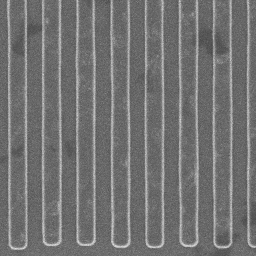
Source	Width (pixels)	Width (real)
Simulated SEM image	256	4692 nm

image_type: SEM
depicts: parallel lines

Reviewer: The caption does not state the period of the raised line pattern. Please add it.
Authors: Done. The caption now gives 626 nm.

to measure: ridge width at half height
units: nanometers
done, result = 318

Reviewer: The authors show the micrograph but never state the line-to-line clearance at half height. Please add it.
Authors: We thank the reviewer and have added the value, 0.3 um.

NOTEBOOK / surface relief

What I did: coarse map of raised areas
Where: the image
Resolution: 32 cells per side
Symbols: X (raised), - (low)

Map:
-XX--XXX--XX--XX--XX---XX--XX--X
-XX--XX---XX--XX--XX---XX--XX--X
-XX--XX---XX--XX--XX---XX--XX--X
-XX--XX---XX--XX--XX---XX--XX--X
-XX--XX---XX--XX--XX---XX--XX--X
-XX--XX---XX--XX--XX---XX--XX--X
-XX--XX---XX--XX--XX---XX--XX--X
-XX--XX---XX--XX--XX---XX--XX--X
-XX--XX---XX--XX--XX---XX--XX--X
-XX--XX---XX--XX--XX---XX--XX--X
-XX--XX---XX--XX--XX---XX--XX--X
-XX--XX---XX--XX--XX---XX--XX--X
-XX--XX---XX--XX--XX---XX--XX--X
-XX--XX---XX--XX--XX---XX--XX--X
-XX--XX---XX--XX--XX---XX--XX--X
-XX--XX---XX--XX--XX---XX--XX--X
-XX--XX---XX--XX--XX---XX--XX--X
-XX--XX---XX--XX--XX---XX--XX--X
-XX--XXX--XX--XX--XX--XXX--XX--X
-XX--XXX--XX--XX--XX--XXX--XX--X
-XX--XXX--XX--XX--XX--XXX--XX--X
-XX--XXX--XX--XX--XX--XXX--XX--X
-XX--XX---XX--XX--XX--XXX--XX--X
-XX--XXX--XX--XX--XX---XX--XX--X
-XX--XXX--XX--XX--XX---XX--XX--X
-XX--XX---XX--XX--XX---XX--XX--X
-XX--XX---XX--XX--XX---XX--XX--X
-XX--XX---XX--XX--XX---XX--XX--X
-XX--XXX--XX--XX--XX---XX--XX--X
-XX--XXX--XX--XX--XX---XX--XX--X
-XX---X---X---XX--XX---X---XX--X
--------------------------------